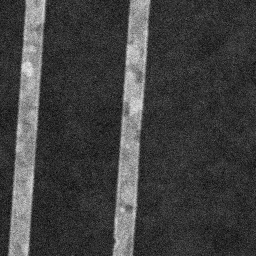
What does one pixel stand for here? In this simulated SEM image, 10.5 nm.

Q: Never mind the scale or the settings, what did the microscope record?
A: one or a few lines or trenches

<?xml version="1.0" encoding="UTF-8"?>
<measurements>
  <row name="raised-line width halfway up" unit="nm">180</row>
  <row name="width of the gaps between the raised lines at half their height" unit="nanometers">905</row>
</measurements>